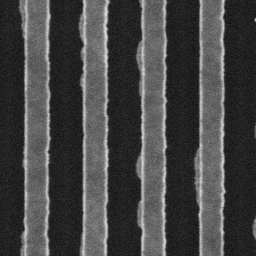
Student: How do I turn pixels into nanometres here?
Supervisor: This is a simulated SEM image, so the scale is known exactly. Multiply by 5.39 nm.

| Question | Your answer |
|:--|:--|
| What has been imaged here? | lines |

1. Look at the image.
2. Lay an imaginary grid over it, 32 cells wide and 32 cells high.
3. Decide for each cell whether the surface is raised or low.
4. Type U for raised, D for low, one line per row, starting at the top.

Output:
DDDUUUDDDDUUUUDDDDUUUDDDDUUUDDDD
DDDUUUDDDDUUUDDDDDUUUDDDDUUUDDDD
DDDUUUDDDDDUUDDDDDUUUDDDDUUUDDDD
DDDUUUDDDDUUUDDDDDUUUDDDDUUUDDDD
DDDUUUDDDDUUUDDDDDUUUDDDDUUUDDDD
DDDUUUDDDDDUUDDDDDUUUDDDDUUUDDDD
DDDUUUDDDDUUUDDDDDUUUDDDDUUUDDDD
DDDUUUDDDDUUUDDDDDUUUDDDDUUUDDDD
DDDUUUDDDDUUUDDDDDUUUDDDDUUUDDDD
DDDUUUDDDDUUUDDDDDUUUDDDDUUUDDDD
DDDUUUDDDDUUUDDDDDUUUDDDDUUUDDDD
DDDUUUDDDDUUUDDDDDUUUDDDDUUUDDDD
DDDUUUDDDDUUUDDDDDUUUDDDDUUUDDDD
DDDUUUDDDDUUUDDDDDUUUDDDDUUUDDDD
DDDUUUDDDDUUUDDDDDUUUDDDDUUUDDDD
DDDUUUDDDDUUUDDDDDUUUDDDDUUUDDDD
DDDUUUDDDDUUUDDDDDUUUDDDDUUUDDDD
DDDUUUDDDDUUUDDDDDUUUDDDDUUUDDDD
DDDUUUDDDDUUUDDDDDUUUDDDDUUUDDDD
DDDUUUDDDDUUUDDDDDUUUDDDDUUUDDDD
DDDUUUDDDDUUUDDDDDUUUDDDDUUUDDDD
DDDUUUDDDDUUUDDDDDUUUDDDDUUUDDDD
DDDUUUDDDDUUUDDDDDUUUDDDDUUUDDDD
DDDUUUDDDDUUUDDDDDUUUDDDDUUUDDDD
DDDUUUDDDDUUUDDDDDUUUDDDDUUUDDDD
DDDUUUDDDDUUUDDDDDUUUDDDDUUUDDDD
DDDUUUDDDDUUUDDDDDUUUDDDDUUUDDDD
DDDUUUDDDDUUUDDDDDUUUDDDDUUUDDDD
DDDUUUDDDDUUUDDDDDUUUDDDDUUUDDDD
DDDUUUDDDDUUUDDDDDUUUDDDDUUUDDDD
DDDUUUDDDDUUUDDDDDUUUDDDDUUUDDDD
DDDUUUDDDDUUUDDDDDUUUDDDDUUUDDDD